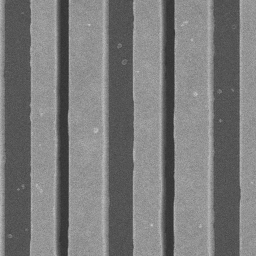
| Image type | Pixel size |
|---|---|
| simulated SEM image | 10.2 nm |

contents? lines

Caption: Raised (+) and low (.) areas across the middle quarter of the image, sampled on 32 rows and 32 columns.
.++++++++++......++++++++...++++
.++++++++++......++++++++...++++
.++++++++++......++++++++...++++
.++++++++++......++++++++...++++
.++++++++++......++++++++...++++
.++++++++++......++++++++...++++
.++++++++++......++++++++...++++
.++++++++++......++++++++...++++
.++++++++++......++++++++...++++
.++++++++++.......+++++++...++++
.++++++++++.......+++++++...++++
.++++++++++.......+++++++...++++
.++++++++++.......+++++++...++++
.++++++++++.......+++++++...++++
.++++++++++......++++++++...++++
.++++++++++......++++++++...++++
.++++++++++.......+++++++...++++
.++++++++++.......+++++++...++++
.++++++++++.......+++++++...++++
.++++++++++......++++++++...++++
.++++++++++......++++++++...++++
.++++++++++......++++++++...++++
.++++++++++......++++++++...++++
.++++++++++......++++++++...++++
.++++++++++......++++++++...++++
.++++++++++.......+++++++...++++
.++++++++++......++++++++...++++
.++++++++++......++++++++...++++
.++++++++++......++++++++...++++
.++++++++++......++++++++...++++
.++++++++++......++++++++...++++
.++++++++++......++++++++...++++